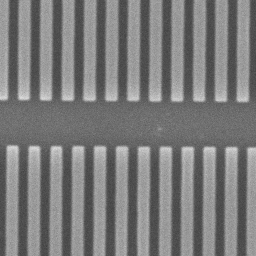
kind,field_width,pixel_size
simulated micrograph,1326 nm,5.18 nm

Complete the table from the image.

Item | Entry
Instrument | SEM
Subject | groups of lines, slits or small figures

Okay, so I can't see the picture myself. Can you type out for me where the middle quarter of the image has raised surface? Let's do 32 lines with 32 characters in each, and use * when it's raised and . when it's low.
**...***...**...***...**...***..
**...***...**...***...**...***..
**...***...**...***...**...***..
**...***...**...***...**...***..
**...***...**...***..***...***..
**...***...**...***..***...***..
**...***...**...***..***...***..
**...***...**...***..***...***..
**...***...**...***..***...***..
................................
................................
................................
................................
................................
................................
................................
................................
................................
................................
................................
................................
..***...**...***...**...***...**
..***...**...***...**...***...**
..***...**...***...**...***...**
..***...**...***...**...***...**
..***...**...***...**...***...**
..***...**...***...**...***...**
..***...**...***...**...***...**
..***...**...***...**...***...**
..***...**...***...**...***...**
..***...**...***...**...***...**
..***...**...***...**...***...**